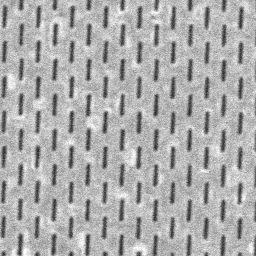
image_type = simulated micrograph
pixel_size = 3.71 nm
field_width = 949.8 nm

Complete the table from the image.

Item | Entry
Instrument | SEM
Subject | a regular array of holes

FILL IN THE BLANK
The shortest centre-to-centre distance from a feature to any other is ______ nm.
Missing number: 89.3